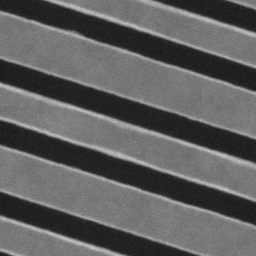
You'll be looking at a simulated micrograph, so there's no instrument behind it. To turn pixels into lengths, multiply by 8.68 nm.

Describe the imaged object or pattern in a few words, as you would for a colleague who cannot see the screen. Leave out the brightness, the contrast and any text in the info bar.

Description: lines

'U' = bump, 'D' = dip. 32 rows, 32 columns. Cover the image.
DDDDDDDUUUUUUUUUUUUUUDDDDDDDDDUU
DDDDDDDDDDUUUUUUUUUUUUUUDDDDDDDD
UUUUDDDDDDDDDUUUUUUUUUUUUUUDDDDD
UUUUUUUDDDDDDDDDUUUUUUUUUUUUUUDD
UUUUUUUUUUDDDDDDDDDDUUUUUUUUUUUU
UUUUUUUUUUUUUDDDDDDDDDDUUUUUUUUU
UUUUUUUUUUUUUUUUDDDDDDDDDDUUUUUU
DUUUUUUUUUUUUUUUUUUDDDDDDDDDDUUU
DDDDUUUUUUUUUUUUUUUUUUUDDDDDDDDD
DDDDDDDUUUUUUUUUUUUUUUUUUUDDDDDD
UDDDDDDDDDUUUUUUUUUUUUUUUUUUUDDD
UUUUDDDDDDDDDUUUUUUUUUUUUUUUUUUU
UUUUUUUDDDDDDDDDUUUUUUUUUUUUUUUU
UUUUUUUUUUDDDDDDDDDDUUUUUUUUUUUU
UUUUUUUUUUUUUDDDDDDDDDDUUUUUUUUU
DDUUUUUUUUUUUUUUDDDDDDDDDDUUUUUU
DDDDDUUUUUUUUUUUUUUUDDDDDDDDDUUU
DDDDDDDDUUUUUUUUUUUUUUUDDDDDDDDD
UDDDDDDDDDDUUUUUUUUUUUUUUUDDDDDD
UUUUDDDDDDDDDDUUUUUUUUUUUUUUUDDD
UUUUUUUUDDDDDDDDDUUUUUUUUUUUUUUU
UUUUUUUUUUUDDDDDDDDDUUUUUUUUUUUU
UUUUUUUUUUUUUUDDDDDDDDDUUUUUUUUU
UUUUUUUUUUUUUUUUUDDDDDDDDDDUUUUU
DDUUUUUUUUUUUUUUUUUUDDDDDDDDDDUU
DDDDDUUUUUUUUUUUUUUUUUUDDDDDDDDD
DDDDDDDDUUUUUUUUUUUUUUUUUUUDDDDD
UUDDDDDDDDDUUUUUUUUUUUUUUUUUUUDD
UUUUUDDDDDDDDDUUUUUUUUUUUUUUUUUU
UUUUUUUUDDDDDDDDDUUUUUUUUUUUUUUU
UUUUUUUUUUUDDDDDDDDDUUUUUUUUUUUU
DUUUUUUUUUUUUUDDDDDDDDDDUUUUUUUU